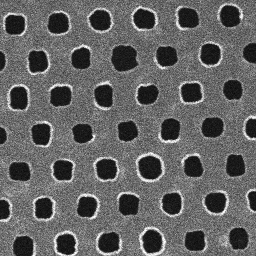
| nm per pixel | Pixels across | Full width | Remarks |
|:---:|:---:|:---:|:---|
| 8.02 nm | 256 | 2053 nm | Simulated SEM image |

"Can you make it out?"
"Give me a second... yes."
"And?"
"a regular array of holes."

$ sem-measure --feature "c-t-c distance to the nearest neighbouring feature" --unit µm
0.337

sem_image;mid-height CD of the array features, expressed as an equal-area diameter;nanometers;170